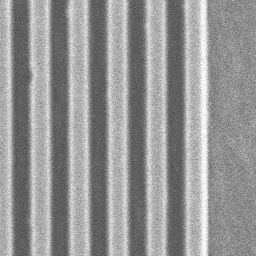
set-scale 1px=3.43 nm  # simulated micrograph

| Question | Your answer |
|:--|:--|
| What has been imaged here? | parallel lines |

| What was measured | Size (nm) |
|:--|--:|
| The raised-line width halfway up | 71.2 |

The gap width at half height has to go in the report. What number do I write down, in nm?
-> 62.2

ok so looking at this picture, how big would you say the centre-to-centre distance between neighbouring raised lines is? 133 nanometers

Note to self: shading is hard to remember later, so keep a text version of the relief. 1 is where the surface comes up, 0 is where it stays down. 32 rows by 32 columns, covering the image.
10001100111001110011100111000000
10001100111001110011100111000000
10001100111001110011100111000000
10001100011001110011100111000000
10001100011001110011100111000000
10001100011001110011100111000000
10001100011001110011100111000000
10001100011001110011100111000000
10001100011001110011100111000000
10001100011001110011100111000000
10001100011001110011100111000000
10001100011001110011100111000000
10001100011001110011100111000000
10001100011001110011100111000000
10001100011001110011100111000000
10001100011001110011100111000000
10001100011001110011100111000000
10001100011001110011100111000000
10001100011001110011100111000000
10001100011001110011100111000000
10001100011001110011100111000000
10001100011001110011100111000000
10001100011001110011100111000000
10001100011001110011100111000000
10001100011001110011100111000000
10001100011000110011100111000000
10001100011000110011100111000000
10001100011000110011100111000000
11001100011000110011100111000000
11001100011000110011100111000000
11001100011000110011100111000000
11001100011000110011100111000000